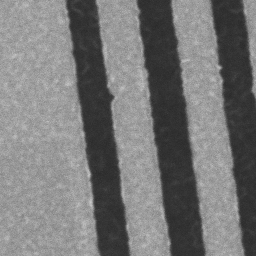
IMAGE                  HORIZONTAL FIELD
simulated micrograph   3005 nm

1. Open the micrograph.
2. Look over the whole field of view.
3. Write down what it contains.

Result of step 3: one or a few lines or trenches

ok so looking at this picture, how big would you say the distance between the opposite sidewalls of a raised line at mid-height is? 413 nm